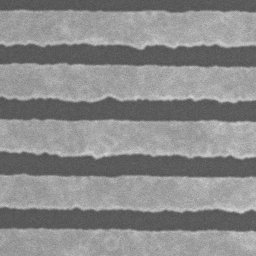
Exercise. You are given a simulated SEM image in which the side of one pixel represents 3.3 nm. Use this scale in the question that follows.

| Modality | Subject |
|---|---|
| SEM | lines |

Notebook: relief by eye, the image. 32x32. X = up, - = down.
--------------------------------
XXXXXXXXXXXXX----XXXX--XXXXX-X--
XXXXXXXXXXXXXXXXXXXXXXXXXXXXXXXX
XXXXXXXXXXXXXXXXXXXXXXXXXXXXXXXX
XXXXXXXXXXXXXXXXXXXXXXXXXXXXXXXX
XX--XXX----XXXXXXXXXXXXXXXXXXXXX
--------------------------------
--------------------------------
XXXXXXXXXXXXXXXXXXXXXXXXXXXXXXXX
XXXXXXXXXXXXXXXXXXXXXXXXXXXXXXXX
XXXXXXXXXXXXXXXXXXXXXXXXXXXXXXXX
XXXXXXXXXXXXXXXXXXXXXXXXXXXXXXXX
--------XXXX---X--------X--XXXXX
--------------------------------
--------------------------------
XXXXXXXXXXXXXXXXXXXXXXXXXXXXXXXX
XXXXXXXXXXXXXXXXXXXXXXXXXXXXXXXX
XXXXXXXXXXXXXXXXXXXXXXXXXXXXXXXX
XXXXXXXXXXXXXXXXXXXXXXXXXXXXXXXX
-----------XX----------XXXX-XXXX
--------------------------------
--------------------------------
XXXXXXXXXXXXXXXXXXXXXXXXXXXXXXXX
XXXXXXXXXXXXXXXXXXXXXXXXXXXXXXXX
XXXXXXXXXXXXXXXXXXXXXXXXXXXXXXXX
XXXXXXXXXXXXXXXXXXXXXXXXXXXXXXXX
----------------------X------XX-
--------------------------------
--------------------------------
XXXXXXXXXXXXXXXXXXXXXXXXXXXXXXXX
XXXXXXXXXXXXXXXXXXXXXXXXXXXXXXXX
XXXXXXXXXXXXXXXXXXXXXXXXXXXXXXXX